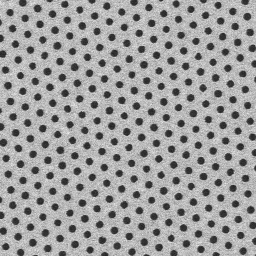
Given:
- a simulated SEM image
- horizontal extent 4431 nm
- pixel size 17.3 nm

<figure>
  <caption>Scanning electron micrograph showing a regular array of holes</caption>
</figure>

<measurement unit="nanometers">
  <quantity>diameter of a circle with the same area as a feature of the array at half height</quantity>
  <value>131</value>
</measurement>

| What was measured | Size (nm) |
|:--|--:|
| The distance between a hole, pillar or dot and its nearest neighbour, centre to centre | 270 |